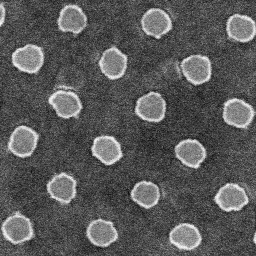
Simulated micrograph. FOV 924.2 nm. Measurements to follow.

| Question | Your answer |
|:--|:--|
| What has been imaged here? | a regular array of raised bodies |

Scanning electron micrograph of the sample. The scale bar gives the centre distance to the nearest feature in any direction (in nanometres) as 212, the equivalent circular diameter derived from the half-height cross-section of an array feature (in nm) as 99.6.